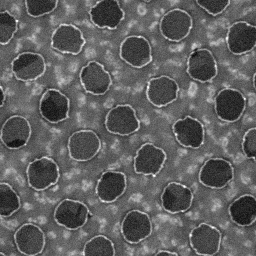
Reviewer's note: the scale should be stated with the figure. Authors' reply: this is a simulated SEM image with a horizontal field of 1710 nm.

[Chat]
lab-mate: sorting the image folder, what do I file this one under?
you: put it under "a regular array of raised bodies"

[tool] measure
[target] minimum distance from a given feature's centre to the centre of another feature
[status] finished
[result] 317 nm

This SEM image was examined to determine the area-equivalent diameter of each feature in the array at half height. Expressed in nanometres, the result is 210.